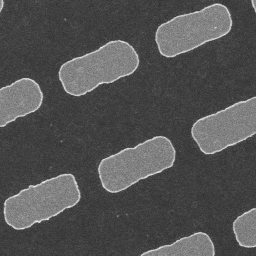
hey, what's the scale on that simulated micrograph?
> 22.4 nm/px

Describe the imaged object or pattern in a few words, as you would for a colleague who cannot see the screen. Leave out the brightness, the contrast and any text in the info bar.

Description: raised bodies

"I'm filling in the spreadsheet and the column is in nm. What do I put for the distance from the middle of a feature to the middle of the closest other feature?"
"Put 2290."